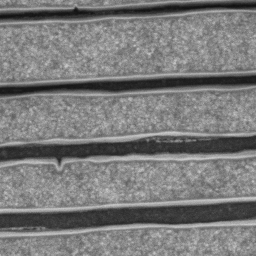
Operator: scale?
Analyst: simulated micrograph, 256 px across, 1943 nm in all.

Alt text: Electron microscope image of one or a few lines or trenches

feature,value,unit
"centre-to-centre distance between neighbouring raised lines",510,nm